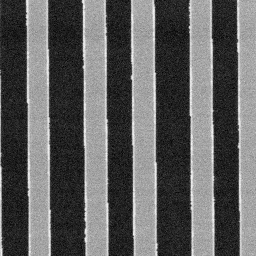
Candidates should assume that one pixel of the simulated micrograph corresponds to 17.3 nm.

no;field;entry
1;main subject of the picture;lines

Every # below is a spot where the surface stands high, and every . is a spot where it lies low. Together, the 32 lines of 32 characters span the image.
...###....###...###.....##....##
...###....###...###.....##....##
...###....###...###.....##....##
...###....###...###.....##....##
...###....###...###.....##....##
...###....###...###.....##....##
...###....###....##.....##....##
...###.....##...###.....##....##
...###.....##....##.....##....##
...###.....##....##.....##....##
...###.....##....##.....##....##
...###.....##....##.....##....##
...###.....##....##.....##....##
....##.....##....##.....##....##
....##.....##....##.....##....##
....##.....##....##.....##....##
....##.....##....##.....###...##
....##.....##....##.....###...##
....##.....##....##.....###...##
....##.....##....##.....###...##
....##.....##....##.....###...##
....##.....##....##.....###...##
....##.....##....##.....###...##
....##.....##....##.....###...##
....##.....##....##.....###...##
....##.....##....##.....###...##
....##.....##....##.....###...##
....##.....##....##.....###...##
....##.....##....##.....###...##
....##.....##....##.....###...##
....##.....##....##.....###...##
....##.....##....##.....###...##